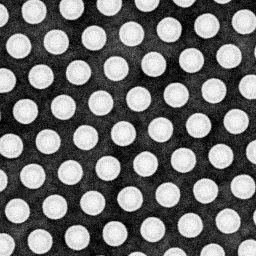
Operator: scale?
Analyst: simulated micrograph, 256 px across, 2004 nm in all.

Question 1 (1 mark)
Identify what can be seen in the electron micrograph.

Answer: an array of small figures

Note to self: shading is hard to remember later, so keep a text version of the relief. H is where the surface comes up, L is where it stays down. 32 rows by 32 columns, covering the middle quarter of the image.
LHHHHHLLLLHHHHHHLLLHHHHHHLLLLHHH
LHHHHHHLLLHHHHHHLLLLHHHHHLLLLLHH
LHHHHHHLLLHHHHHHLLLLLHHHLLLLLLLL
LHHHHHLLLLLHHHHLLLLLLLLLLLLLLLLL
LLHHHLLLLLLLLLLLLLLLLLLLLLLLLLLL
LLLLLLLLLLLLLLLLLLLLLLLLLLHHHHLL
LLLLLLLLLLLLLLLLLHHHHLLLLHHHHHHL
LLLLLLLHHHHLLLLLHHHHHLLLLHHHHHHL
HHLLLLHHHHHHLLLLHHHHHHLLLHHHHHHL
HHHLLLHHHHHHLLLLHHHHHHLLLHHHHHHL
HHHLLLHHHHHHLLLLHHHHHLLLLLLHHLLL
HHHLLLLHHHHHLLLLLHHHLLLLLLLLLLLL
HHLLLLLLHHLLLLLLLLLLLLLLLLLLLLLL
HLLLLLLLLLLLLLLLLLLLLLLLHLLLLLLH
LLLLLLLLLLLLLLHHLLLLLLHHHHHLLLLH
LLLLHHLLLLLLLHHHHLLLLHHHHHHLLLLH
LLLHHHHHLLLLHHHHHHLLLHHHHHHLLLLH
LLHHHHHHLLLLHHHHHHLLLHHHHHHLLLLH
LLHHHHHHLLLLHHHHHHLLLLHHHHLLLLLL
LLLHHHHHLLLLLHHHHLLLLLLLLLLLLLLL
LLLHHHHHLLLLLLLLLLLLLLLLLLLLLLLL
LLLLLLLLLLLLLLLLLLLLLLLLLLLLHHHH
LLLLLLLLLLLLLLLLLLLHHHLLLLLHHHHH
LLLLLLLLLHHHHLLLLLHHHHHLLLLHHHHH
HHHLLLLLHHHHHHLLLHHHHHHLLLLHHHHH
HHHHLLLLHHHHHHLLLHHHHHHLLLLHHHHH
HHHHHLLLHHHHHHLLLLHHHHHLLLLLHHHH
HHHHHLLLHHHHHHLLLLLHHHLLLLLLLLLL
HHHHLLLLLHHHHLLLLLLLLLLLLLLLLLLL
HHHLLLLLLLLLLLLLLLLLLLLLLLLLLLLL
LLLLLLLLLLLLLLLLLLLLLLLLHHHHLLLL
LLLLLLLLLLLLLLLHHHHLLLLHHHHHHLLL